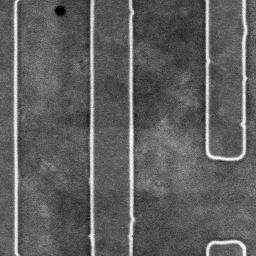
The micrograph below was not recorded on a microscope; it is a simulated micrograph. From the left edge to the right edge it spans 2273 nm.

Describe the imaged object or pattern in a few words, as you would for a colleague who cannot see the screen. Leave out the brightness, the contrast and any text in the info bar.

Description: one or a few lines or trenches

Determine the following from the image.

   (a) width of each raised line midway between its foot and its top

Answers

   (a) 342 nm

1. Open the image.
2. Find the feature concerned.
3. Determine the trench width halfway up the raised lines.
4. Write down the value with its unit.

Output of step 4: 0.676 microns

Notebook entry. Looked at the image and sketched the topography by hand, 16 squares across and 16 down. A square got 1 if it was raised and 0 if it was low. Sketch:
1000001100000110
1000001100000110
1000001100000110
1000001100000110
1000001100000110
1000001100000110
1000001100000110
1000001100000110
1000001100000110
1000001100000110
1000001100000000
1000001100000000
1000001100000000
1000001100000000
1000001100000000
1000001100000110